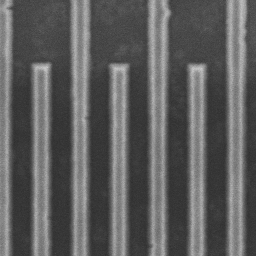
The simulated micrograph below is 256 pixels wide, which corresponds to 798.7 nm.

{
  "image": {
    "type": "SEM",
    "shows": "parallel lines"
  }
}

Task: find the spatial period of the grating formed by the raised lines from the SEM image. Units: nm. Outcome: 122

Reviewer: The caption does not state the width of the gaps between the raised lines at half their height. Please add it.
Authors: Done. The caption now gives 75.4 nm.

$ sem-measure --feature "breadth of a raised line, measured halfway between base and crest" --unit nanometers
46.5